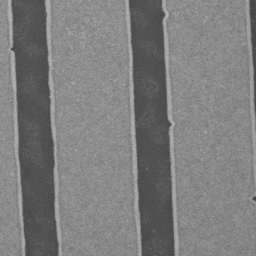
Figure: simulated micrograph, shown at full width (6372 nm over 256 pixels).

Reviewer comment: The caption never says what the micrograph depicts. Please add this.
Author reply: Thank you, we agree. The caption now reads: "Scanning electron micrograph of one or a few lines or trenches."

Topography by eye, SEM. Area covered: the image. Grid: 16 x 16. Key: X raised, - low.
X--XXXXX--XXXXX-
X--XXXXX--XXXXXX
X--XXXXX--XXXXXX
X--XXXXX--XXXXXX
X--XXXXX--XXXXXX
X--XXXXX---XXXXX
X--XXXXX---XXXXX
X--XXXXX---XXXXX
X--XXXXX---XXXXX
X--XXXXX---XXXXX
X--XXXXX---XXXXX
X---XXXX---XXXXX
X---XXXXX--XXXXX
X---XXXXX--XXXXX
X---XXXXX--XXXXX
X---XXXXX--XXXXX